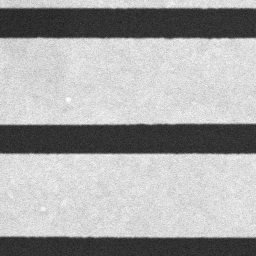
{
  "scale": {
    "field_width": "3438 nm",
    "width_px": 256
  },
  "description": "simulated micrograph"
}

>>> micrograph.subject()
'lines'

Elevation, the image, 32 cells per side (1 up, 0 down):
11111111111111111111111111111111
00000000000000000000000000000000
00000000000000000000000000000000
00000000000000000000000000000000
00000000000000000000000000000000
11111111111111111111111111111111
11111111111111111111111111111111
11111111111111111111111111111111
11111111111111111111111111111111
11111111111111111111111111111111
11111111111111111111111111111111
11111111111111111111111111111111
11111111111111111111111111111111
11111111111111111111111111111111
11111111111111111111111111111111
11111111111111111010110010000000
00000000000000000000000000000000
00000000000000000000000000000000
00000000000000000000000000000000
11111111111111111111111111111111
11111111111111111111111111111111
11111111111111111111111111111111
11111111111111111111111111111111
11111111111111111111111111111111
11111111111111111111111111111111
11111111111111111111111111111111
11111111111111111111111111111111
11111111111111111111111111111111
11111111111111111111111111111111
00011100111111111111111111111111
00000000000000000000000000000000
00000000000000000000000000000000